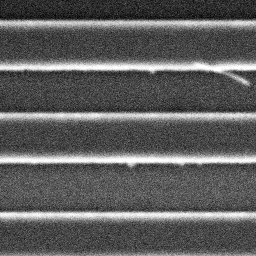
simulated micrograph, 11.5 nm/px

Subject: lines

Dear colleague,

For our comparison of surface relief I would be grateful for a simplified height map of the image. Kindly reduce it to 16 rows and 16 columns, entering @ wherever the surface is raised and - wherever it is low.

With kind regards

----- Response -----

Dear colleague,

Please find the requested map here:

----------------
@@@@@@@@@@@@@@@@
@@@@@@@@@@@@@@@@
@@@@@@@@@@@@@@@@
----------------
----------------
----------------
@@@@@@@@@@@@@@@@
@@@@@@@@@@@@@@@@
@@@@@@@@@@@@@@@@
----------------
----------------
----------------
@@@@@@@@@@@@@@@@
@@@@@@@@@@@@@@@@
@@@@@@@@@@@@@@@@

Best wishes